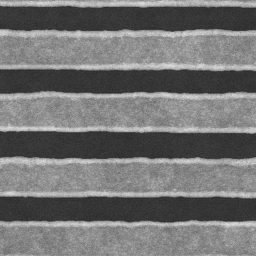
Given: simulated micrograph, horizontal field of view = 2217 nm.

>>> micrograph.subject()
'lines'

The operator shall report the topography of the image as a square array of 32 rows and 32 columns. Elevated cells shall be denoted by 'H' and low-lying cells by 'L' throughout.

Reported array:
HHHHHHHHHHHHHHHHHHHHHHHHHHHHHHHH
LLLLLLLLLLLLLLLLLLLLLLLLLLLLLLLL
LLLLLLLLLLLLLLLLLLLLLLLLLLLLLLLL
LLLLLLLLLLLLLLLLLLLLLLLLLLLLLLLL
HHHHHHHHHHHHHHHHHHHHHHHHHHHHHHHH
HHHHHHHHHHHHHHHHHHHHHHHHHHHHHHHH
HHHHHHHHHHHHHHHHHHHHHHHHHHHHHHHH
HHHHHHHHHHHHHHHHHHHHHHHHHHHHHHHH
HHHLLLHHHHHHHHHHHHHHHHHHHHHHHHHH
LLLLLLLLLLLLLLLLLLLLLLLLLLLLLLLL
LLLLLLLLLLLLLLLLLLLLLLLLLLLLLLLL
LLLLLLLLLLLLLLLLLLLLLLLLLLLLLLLL
HHHHHHHHHHHHHHHHHHHHHHHHHHHHHHHH
HHHHHHHHHHHHHHHHHHHHHHHHHHHHHHHH
HHHHHHHHHHHHHHHHHHHHHHHHHHHHHHHH
HHHHHHHHHHHHHHHHHHHHHHHHHHHHHHHH
LLLLLLLLLLLLLLLLLLLLLLHLLLHHHHHH
LLLLLLLLLLLLLLLLLLLLLLLLLLLLLLLL
LLLLLLLLLLLLLLLLLLLLLLLLLLLLLLLL
LLLLLLLLLLLLLLLLLLLLLLLLLLLLLLLL
HHHHHHHHHHHHHHHHHHHHHHHHHHHHHHHH
HHHHHHHHHHHHHHHHHHHHHHHHHHHHHHHH
HHHHHHHHHHHHHHHHHHHHHHHHHHHHHHHH
HHHHHHHHHHHHHHHHHHHHHHHHHHHHHHHH
LLLLLLLLLLLLLLLLLLLLLLLLHHLLHHHH
LLLLLLLLLLLLLLLLLLLLLLLLLLLLLLLL
LLLLLLLLLLLLLLLLLLLLLLLLLLLLLLLL
LLLLLLLLLLLLLLLLLLLLLLLLLLLLLLLL
HHHHHHHHHHHHHHHHHHHHHHHHHHHHHHHH
HHHHHHHHHHHHHHHHHHHHHHHHHHHHHHHH
HHHHHHHHHHHHHHHHHHHHHHHHHHHHHHHH
HHHHHHHHHHHHHHHHHHHHHHHHHHHHHHHH